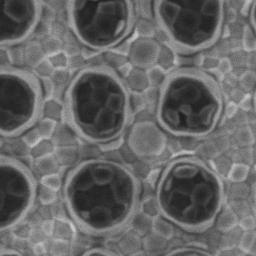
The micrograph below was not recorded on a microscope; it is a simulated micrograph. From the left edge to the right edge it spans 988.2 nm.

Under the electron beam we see raised bodies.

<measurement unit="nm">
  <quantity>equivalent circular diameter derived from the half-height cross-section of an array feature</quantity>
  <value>259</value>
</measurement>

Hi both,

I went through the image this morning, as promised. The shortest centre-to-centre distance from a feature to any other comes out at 0.339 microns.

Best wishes